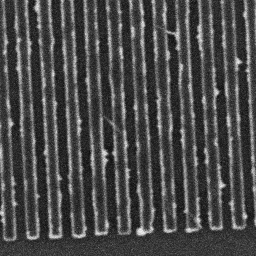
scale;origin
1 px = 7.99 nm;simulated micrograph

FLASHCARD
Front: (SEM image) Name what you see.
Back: parallel lines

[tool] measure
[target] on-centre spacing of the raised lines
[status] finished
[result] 183 nanometers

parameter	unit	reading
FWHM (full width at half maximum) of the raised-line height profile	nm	98.8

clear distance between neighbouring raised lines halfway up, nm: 83.8